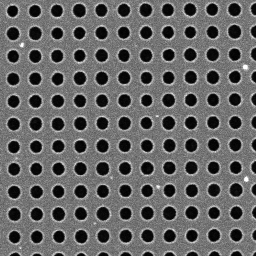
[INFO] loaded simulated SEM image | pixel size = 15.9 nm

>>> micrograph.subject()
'a regular array of holes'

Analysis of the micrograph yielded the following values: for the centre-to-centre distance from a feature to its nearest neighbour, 351 nm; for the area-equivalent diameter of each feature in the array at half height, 202 nanometers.